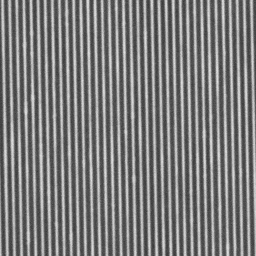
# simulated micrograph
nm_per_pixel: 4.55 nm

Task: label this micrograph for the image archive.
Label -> parallel lines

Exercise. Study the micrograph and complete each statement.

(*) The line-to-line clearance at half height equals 0.0244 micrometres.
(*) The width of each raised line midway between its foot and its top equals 8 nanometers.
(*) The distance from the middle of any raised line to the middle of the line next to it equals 32.3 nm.